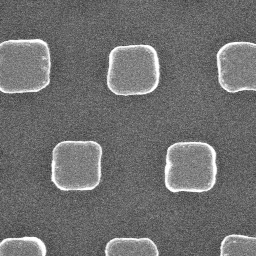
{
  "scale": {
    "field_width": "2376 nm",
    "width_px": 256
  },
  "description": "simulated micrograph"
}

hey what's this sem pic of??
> raised bodies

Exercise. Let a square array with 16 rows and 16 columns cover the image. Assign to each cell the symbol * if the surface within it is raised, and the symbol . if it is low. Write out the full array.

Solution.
................
................
................
***....***....**
***....***....**
***....***....**
................
................
................
...***.....**...
...***....****..
....**....***...
................
................
................
***....***....**